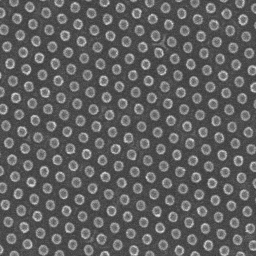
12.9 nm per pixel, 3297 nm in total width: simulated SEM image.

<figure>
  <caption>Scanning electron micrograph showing a regular array of raised bodies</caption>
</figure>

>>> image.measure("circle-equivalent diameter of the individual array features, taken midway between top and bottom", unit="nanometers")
124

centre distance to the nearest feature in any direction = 218 nm